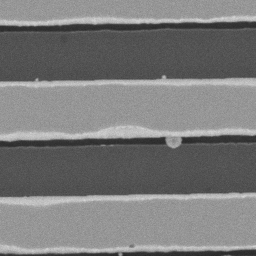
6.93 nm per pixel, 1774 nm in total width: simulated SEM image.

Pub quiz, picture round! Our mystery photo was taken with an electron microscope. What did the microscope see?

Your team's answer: lines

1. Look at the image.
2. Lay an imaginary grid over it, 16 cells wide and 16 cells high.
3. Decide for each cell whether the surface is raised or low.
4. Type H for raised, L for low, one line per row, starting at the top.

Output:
HHHHHHHHHHHHHHHH
HHHHHLLLLLLLLLLL
LLLLLLLLLLLLLLLL
LLLLLLLLLLLLLLLL
LLLLLLLLLLLLLLLL
HHHHHHHHHHHHHHHH
HHHHHHHHHHHHHHHH
HHHHHHHHHHHHHHHH
HHHHHHHHHHHHHLLL
LLLLLLLLLLLLLLLL
LLLLLLLLLLLLLLLL
LLLLLLLLLLLLLLLL
HHHHHHHHHHHHHHHH
HHHHHHHHHHHHHHHH
HHHHHHHHHHHHHHHH
HHHHHHHHHHHHHHHH